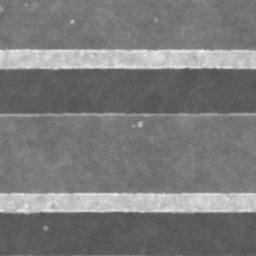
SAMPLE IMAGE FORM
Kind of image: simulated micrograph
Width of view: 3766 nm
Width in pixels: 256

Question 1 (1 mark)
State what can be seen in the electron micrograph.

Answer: lines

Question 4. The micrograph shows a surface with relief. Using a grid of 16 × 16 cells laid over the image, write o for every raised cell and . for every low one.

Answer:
oooooooooooooooo
oooooooooooooooo
oooooooooooooooo
oooooooooooooooo
................
................
................
oooooooooooooooo
oooooooooooooooo
oooooooooooooooo
oooooooooooooooo
oooooooooooooooo
oooooooooooooooo
................
................
................